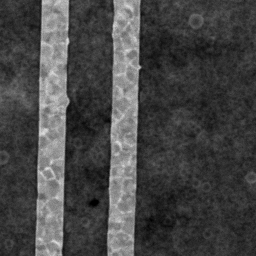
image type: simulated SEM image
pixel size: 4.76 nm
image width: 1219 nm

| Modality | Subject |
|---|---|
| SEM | one or a few lines or trenches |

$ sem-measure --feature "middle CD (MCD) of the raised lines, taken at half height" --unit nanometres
124